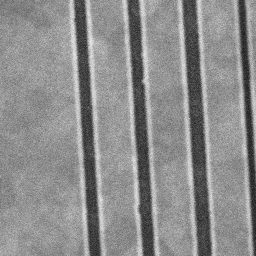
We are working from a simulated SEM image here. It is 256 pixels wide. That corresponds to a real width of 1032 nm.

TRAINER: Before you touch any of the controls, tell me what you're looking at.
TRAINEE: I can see parallel lines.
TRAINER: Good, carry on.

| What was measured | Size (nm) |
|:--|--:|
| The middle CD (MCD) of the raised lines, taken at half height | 153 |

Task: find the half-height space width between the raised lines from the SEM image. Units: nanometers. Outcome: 65.8